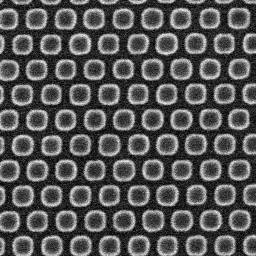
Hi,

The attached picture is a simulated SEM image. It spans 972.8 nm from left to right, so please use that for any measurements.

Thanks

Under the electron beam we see a regular array of raised bodies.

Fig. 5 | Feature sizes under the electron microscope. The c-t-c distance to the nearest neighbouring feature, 109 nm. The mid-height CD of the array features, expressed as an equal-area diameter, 21.2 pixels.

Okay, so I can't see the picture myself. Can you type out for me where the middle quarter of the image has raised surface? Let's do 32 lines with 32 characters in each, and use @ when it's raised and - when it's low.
@@@--@@@@@---@@@@---@@@@@--@@@@@
@@@--@@@@@--@@@@@---@@@@@--@@@@@
@@@--@@@@@--@@@@@---@@@@---@@@@@
@@----@@@----@@@----@@@@----@@@-
--------------------------------
--@@@@----@@@----@@@----@@@@---@
--@@@@---@@@@@--@@@@@--@@@@@---@
--@@@@---@@@@@--@@@@@--@@@@@---@
--@@@@---@@@@@--@@@@@--@@@@@--@@
--@@@@---@@@@---@@@@----@@@@---@
--------------------------------
----------------------------@@@-
@@@--@@@@@---@@@@---@@@@---@@@@@
@@@--@@@@@--@@@@@---@@@@@--@@@@@
@@@--@@@@@--@@@@@---@@@@---@@@@@
@@@--@@@@@---@@@@---@@@@---@@@@@
--------------------------------
--------------------------------
--@@@@---@@@@@---@@@@---@@@@---@
--@@@@---@@@@@--@@@@@--@@@@@--@@
--@@@@---@@@@@--@@@@@--@@@@@--@@
--@@@@---@@@@@--@@@@@--@@@@@--@@
--@@@----@@@@----@@@----@@@----@
--------------------------------
@@----@@@@---@@@@----@@@----@@@-
@@@--@@@@@--@@@@@@--@@@@---@@@@@
@@@--@@@@@--@@@@@@--@@@@---@@@@@
@@@--@@@@@--@@@@@@--@@@@---@@@@@
@@----@@@@---@@@@---@@@@----@@@-
--------------------------------
--------------------------------
--@@@@---@@@@@--@@@@@---@@@@---@